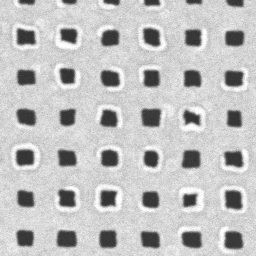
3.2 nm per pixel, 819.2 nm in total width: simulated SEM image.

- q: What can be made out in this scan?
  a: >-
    a regular array of holes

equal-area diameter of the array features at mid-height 18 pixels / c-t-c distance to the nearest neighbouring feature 40.2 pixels